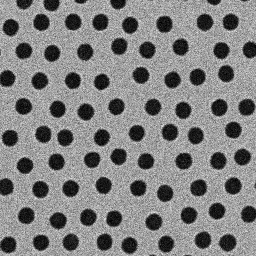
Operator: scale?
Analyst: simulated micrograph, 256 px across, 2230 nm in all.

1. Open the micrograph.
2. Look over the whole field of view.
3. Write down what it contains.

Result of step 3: a regular array of holes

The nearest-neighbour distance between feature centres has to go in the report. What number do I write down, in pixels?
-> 26.3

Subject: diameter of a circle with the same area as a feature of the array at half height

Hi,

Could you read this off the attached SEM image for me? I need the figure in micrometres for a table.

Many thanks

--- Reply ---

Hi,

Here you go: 0.146